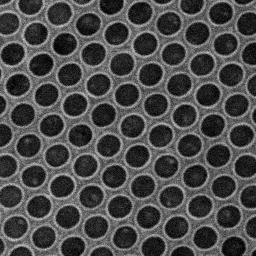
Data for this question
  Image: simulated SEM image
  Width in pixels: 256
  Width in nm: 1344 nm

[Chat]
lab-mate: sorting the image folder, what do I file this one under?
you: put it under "a regular array of holes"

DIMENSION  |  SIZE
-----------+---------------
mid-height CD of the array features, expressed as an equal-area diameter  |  0.127 microns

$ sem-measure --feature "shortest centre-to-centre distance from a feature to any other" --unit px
30.1